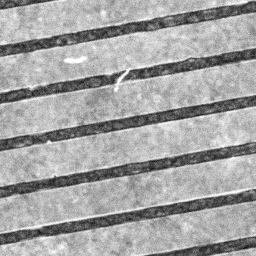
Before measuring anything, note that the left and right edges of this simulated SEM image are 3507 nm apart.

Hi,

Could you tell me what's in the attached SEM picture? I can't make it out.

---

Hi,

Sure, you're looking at parallel lines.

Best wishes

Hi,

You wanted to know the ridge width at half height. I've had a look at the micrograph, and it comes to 34 pixels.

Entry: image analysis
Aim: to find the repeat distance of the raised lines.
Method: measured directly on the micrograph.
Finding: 634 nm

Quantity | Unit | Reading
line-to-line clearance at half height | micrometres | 0.172